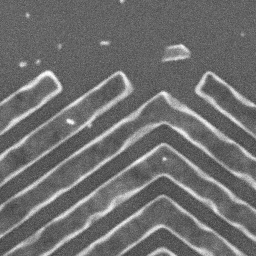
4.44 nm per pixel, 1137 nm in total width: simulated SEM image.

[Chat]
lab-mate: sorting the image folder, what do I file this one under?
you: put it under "groups of lines, slits or small figures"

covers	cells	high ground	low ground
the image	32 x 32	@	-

--------------------------------
--------------------------------
--------------------------------
--------------------------------
--------------------------------
--------------------------------
----------------------@---------
--------------------------------
--------------------------------
-----@@-------@@----------@-----
----@@@------@@@---------@@@----
--@@@@@----@@@@@---------@@@@---
-@@@@@----@@@@@----@@-----@@@@--
@@@@@---@@@@@-----@@@@@----@@@@@
@@@----@@@@@----@@@@@@@@@----@@@
@@---@@@@@@----@@@@@-@@@@@----@@
@---@@@@@@----@@@@-----@@@@----@
---@@@@@----@@@@--------@@@@@---
-@@@@@@---@@@@@----@@@---@@@@@--
@@@@@----@@@@@----@@@@@---@@@@@-
@@@@---@@@@@@----@@@@@@@---@@@@@
@@----@@@@@----@@@@@@@@@@----@@@
@----@@@@@----@@@@@---@@@@@----@
----@@@@@---@@@@@@-----@@@@@----
--@@@@@----@@@@@--------@@@@@---
@@@@@@----@@@@----@@@@----@@@@@-
@@@@----@@@@@----@@@@@@----@@@@@
@@@----@@@@-----@@@@@@@@----@@@@
@@---@@@@@@----@@@@@-@@@@@----@@
----@@@@@----@@@@@----@@@@@@---@
---@@@@@----@@@@@------@@@@@@---
-@@@@@-----@@@@@---@@----@@@@@--